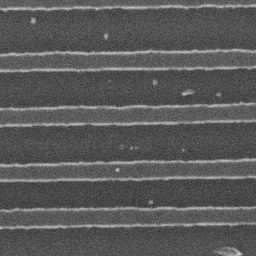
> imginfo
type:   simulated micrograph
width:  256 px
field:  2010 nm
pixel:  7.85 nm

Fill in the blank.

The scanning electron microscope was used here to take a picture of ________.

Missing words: lines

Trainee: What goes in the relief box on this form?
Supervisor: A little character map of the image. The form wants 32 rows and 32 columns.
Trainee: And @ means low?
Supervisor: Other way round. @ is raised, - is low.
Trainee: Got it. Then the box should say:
@@@@@@@@@@@@@@@@@@@@@@@@@@@@@@@@
--------------------------------
--------------------------------
--------------------------------
--------------------------------
--------------------------------
------------------@@@@@@@@@@@@@@
@@@@@@@@@@@@@@@@@@@@@@@@@@@@@@@@
@@@@@@@@@@@@@@@@@@@@@@@@@@@@@@--
--------------------------------
--------------------------------
--------------------------------
--------------------------------
---@-@@@@@@@@@@@@@@@@@@@@@@@@@@@
@@@@@@@@@@@@@@@@@@@@@@@@@@@@@@@@
@@@@@@@@@@-@@@-@@---------------
--------------------------------
--------------------------------
--------------------------------
--------------------------------
--------@@@@@@@@@@@@@@@@@@@@@@@@
@@@@@@@@@@@@@@@@@@@@@@@@@@@@@@@@
@@@@@@@@@@@@@---@@--------------
--------------------------------
--------------------------------
--------------------------------
@@@@@@@@@@@@@@@@@@@@@@@@@@@@@@@@
@@@@@@@@@@@@@@@@@@@@@@@@@@@@@@@@
@-------------------------------
--------------------------------
--------------------------------
--------------------------------